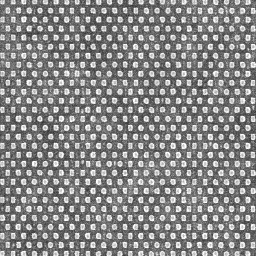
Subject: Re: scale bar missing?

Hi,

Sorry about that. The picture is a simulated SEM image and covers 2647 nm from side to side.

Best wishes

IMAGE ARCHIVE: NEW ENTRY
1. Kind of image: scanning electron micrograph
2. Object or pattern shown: a regular array of raised bodies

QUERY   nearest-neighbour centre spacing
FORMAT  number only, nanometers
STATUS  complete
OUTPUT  107